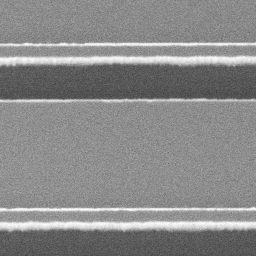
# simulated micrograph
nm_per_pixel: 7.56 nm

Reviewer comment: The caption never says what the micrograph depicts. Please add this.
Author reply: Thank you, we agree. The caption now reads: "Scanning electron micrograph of lines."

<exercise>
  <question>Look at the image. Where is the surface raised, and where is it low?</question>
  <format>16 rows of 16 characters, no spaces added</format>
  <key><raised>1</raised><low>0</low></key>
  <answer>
1111111111111111
1111111111111111
1111111111111111
1111111111111111
0000000000000000
0000000000000000
1111111111111111
1111111111111111
1111111111111111
1111111111111111
1111111111111111
1111111111111111
1111111111111111
1111111111111111
0000000000000000
0000000000000000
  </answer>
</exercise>